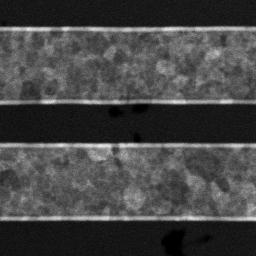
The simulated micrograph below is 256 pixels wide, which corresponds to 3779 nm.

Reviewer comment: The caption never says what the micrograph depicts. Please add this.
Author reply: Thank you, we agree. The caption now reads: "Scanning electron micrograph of wiring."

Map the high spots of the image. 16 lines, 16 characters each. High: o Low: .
................
................
oooooooooooooooo
oooooooooooooooo
oooooooooooooooo
oooooooooooooooo
................
................
................
oooooooooooooooo
oooooooooooooooo
oooooooooooooooo
oooooooooooooooo
oooooooooooooooo
................
................